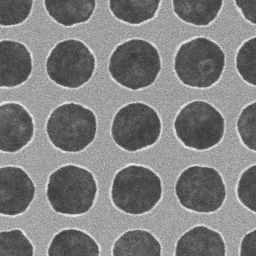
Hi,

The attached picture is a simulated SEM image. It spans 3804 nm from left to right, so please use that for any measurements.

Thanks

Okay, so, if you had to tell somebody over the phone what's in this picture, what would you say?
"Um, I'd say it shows a regular array of holes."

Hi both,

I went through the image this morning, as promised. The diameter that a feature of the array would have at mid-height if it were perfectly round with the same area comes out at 741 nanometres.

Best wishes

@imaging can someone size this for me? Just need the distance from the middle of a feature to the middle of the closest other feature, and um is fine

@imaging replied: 0.932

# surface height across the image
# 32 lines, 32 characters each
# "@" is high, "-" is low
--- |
----@@------@@------@@------@@--
----@@------@@------@@-----@@@--
---@@@@----@@@@----@@@@----@@@@-
@@@@@@@@@@@@@@@@@@@@@@@@@@@@@@@@
@@@@@@@@@@@@@@@@@@@@@@@@@@@@@@@@
---@@@@---@@@@@----@@@@----@@@--
----@@-----@@@------@@------@@--
----@@------@@------@@------@@--
----@@------@@------@@------@@--
----@@-----@@@------@@------@@--
---@@@@---@@@@@----@@@@----@@@@-
@@@@@@@@@@@@@@@@@@@@@@@@@@@@@@@@
@@@@@@@@@@@@@@@@@@@@@@@@@@@@@@@@
---@@@@----@@@@----@@@@----@@@@-
----@@------@@------@@------@@--
----@@------@@------@@------@@--
----@@------@@------@@------@@--
----@@------@@------@@@-----@@--
---@@@@----@@@@---@@@@@@--@@@@@-
@@@@@@@@@@@@@@@@@@@@@@@@@@@@@@@@
@@@@@@@@@@@@@@@@@@@@@@@@@@@@@@@@
---@@@@----@@@@----@@@@----@@@--
----@@------@@------@@------@@--
----@@------@@------@@------@@--
----@@------@@------@@------@@--
----@@------@@------@@@-----@@--
---@@@@----@@@@@--@@@@@@@--@@@@@
@@@@@@@@@@@@@@@@@@@@@@@@@@@@@@@@
@@@@@@@@@@@@@@@@@@@@@@@@--@@@@@@
---@@@@----@@@@----@@@@-----@@@-
----@@------@@------@@------@@--
----@@------@@------@@------@@--